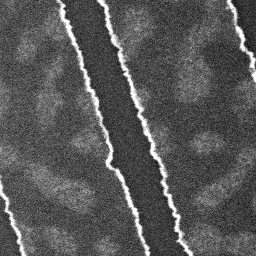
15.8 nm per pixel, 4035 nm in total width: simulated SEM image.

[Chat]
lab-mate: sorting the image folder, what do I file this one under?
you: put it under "one or a few lines or trenches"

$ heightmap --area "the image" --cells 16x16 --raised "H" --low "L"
HHHHLLHHHHHHHHHL
HHHHLLLHHHHHHHHL
HHHHHLLHHHHHHHHL
HHHHHLLHHHHHHHHH
HHHHHLLLHHHHHHHH
HHHHHHLLHHHHHHHH
HHHHHHLLHHHHHHHH
HHHHHHLLLHHHHHHH
HHHHHHHLLHHHHHHH
HHHHHHHLLLHHHHHH
HHHHHHHLLLHHHHHH
HHHHHHHHLLHHHHHH
HHHHHHHHLLLHHHHH
LHHHHHHHHLLHHHHH
LHHHHHHHHLLHHHHH
LHHHHHHHHLLLHHHH